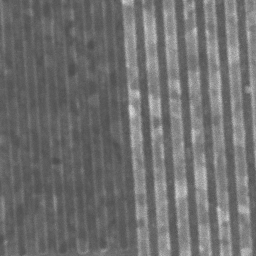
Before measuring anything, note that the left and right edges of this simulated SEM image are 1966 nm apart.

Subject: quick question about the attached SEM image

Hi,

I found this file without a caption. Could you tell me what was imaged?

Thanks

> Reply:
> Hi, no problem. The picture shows parallel lines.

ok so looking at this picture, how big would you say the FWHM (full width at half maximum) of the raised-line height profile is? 10.5 pixels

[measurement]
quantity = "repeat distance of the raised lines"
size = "20.4 px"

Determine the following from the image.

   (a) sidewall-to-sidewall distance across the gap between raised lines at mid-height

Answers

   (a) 10.6 pixels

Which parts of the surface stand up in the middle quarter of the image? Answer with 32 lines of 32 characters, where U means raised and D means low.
DUUDDDUUDDDUUDDDUUDDDUUDDDUUDDDU
DUUDDDUUDDDUUDDDUUDDDUUDDDUUDDDU
DUUDDDUUDDDUUDDDUUDDDUUDDDUUDDDU
DUUDDDUUDDDUUDDDUUDDDUUDDDUUUDDU
DUUDDDUUDDDUUDDDUUDDDUUUDDUUUDDU
DUUDDDUUDDDUUDDDUUUDDUUUDDUUUDDU
DUUDDDUUDDDUUUDDUUUDDUUUDDUUUDDD
DUUDDDUUUDDUUUDDUUUDDUUUDDDUUDDD
DUUUDDUUUDDUUUDDUUUDDUUUDDDUUDDD
DUUUDDUUUDDDUUDDUUUDDDUUDDDUUDDD
DUUUDDUUUDDDUUDDUUUDDDUUDDDUUDDD
DUUUDDUUUDDDUUDDUUUDDDUUDDDUUDDD
DUUUDDUUUDDUUUDDDUUDDDUUDDDUUDDD
DUUUDDUUUDDDUUDDDUUDDDUUDDDUUDDD
DUUUDDDUUDDDUUDDDUUDDDUUDDDUUDDD
DDUUDDUUUDDDUUDDDUUDDDUUDDDUUDDD
DDUUDDDUUDDDUUDDDUUDDDUUDDDUUDDD
DDUUDDDUUDDDUUDDDUUDDDUUDDDUUUDD
DDUUDDDUUDDDUUDDDUUDDDUUDDDUUUDD
DDUUDDDUUUDDUUDDDUUDDDUUUDDUUUDD
DDUUDDDUUUDDUUDDDUUUDDUUUDDUUUDD
DDUUDDDUUUDDUUUDDUUUDDUUUDDUUUDD
DDUUDDDUUUDDUUUDDUUUDDUUUDDDUUDD
DDUUUDDUUUDDUUUDDUUUDDDUUDDDUUDD
DDUUUDDUUUDDUUUDDUUUDDDUUDDDUUDD
DDUUUDDUUUDDUUUDDUUUDDDUUDDDUUDD
DDUUUDDUUUDDDUUDDUUUDDDUUDDDUUDD
DDUUUDDUUUDDDUUDDDUUDDDUUDDDUUDD
DDUUUDDUUUDDDUUDDDUUDDDUUDDDUUDD
DDUUUDDDUUDDDUUDDDUUDDDUUDDDUUDD
DDUUUDDDUUDDDUUDDDUUDDDUUDDDUUUD
DDDUUDDDUUDDDUUDDDUUDDDUUDDDUUUD